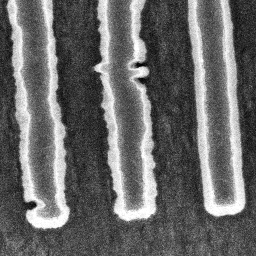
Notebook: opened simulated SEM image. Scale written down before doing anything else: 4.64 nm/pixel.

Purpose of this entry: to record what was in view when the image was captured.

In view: one or a few lines or trenches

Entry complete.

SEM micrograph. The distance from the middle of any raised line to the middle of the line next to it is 412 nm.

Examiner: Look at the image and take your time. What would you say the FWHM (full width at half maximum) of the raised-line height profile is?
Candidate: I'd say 159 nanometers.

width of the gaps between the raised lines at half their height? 250 nm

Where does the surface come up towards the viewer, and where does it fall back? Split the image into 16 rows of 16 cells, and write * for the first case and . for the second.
.**...***...**..
.**...***...**..
.**....**...**..
.**...***...**..
.**...***...**..
.**....**...**..
.**....**...***.
.***...**....**.
..**...**....**.
.***...**....**.
..**...**....**.
..**...**....**.
..**...**....**.
..**............
................
................